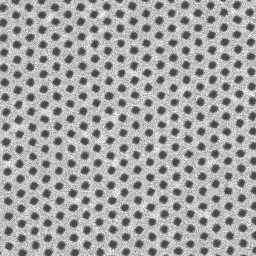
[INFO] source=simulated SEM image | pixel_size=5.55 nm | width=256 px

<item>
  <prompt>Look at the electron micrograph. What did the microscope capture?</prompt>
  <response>a regular array of holes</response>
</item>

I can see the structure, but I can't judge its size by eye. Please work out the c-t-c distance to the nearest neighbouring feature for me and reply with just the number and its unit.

80.8 nm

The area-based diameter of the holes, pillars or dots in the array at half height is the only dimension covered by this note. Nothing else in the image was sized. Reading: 44.3 nanometers